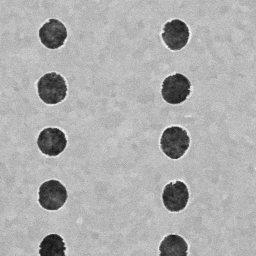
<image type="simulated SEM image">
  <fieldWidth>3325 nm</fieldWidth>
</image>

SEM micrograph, a regular array of holes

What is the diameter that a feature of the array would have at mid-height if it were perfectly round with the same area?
0.385 µm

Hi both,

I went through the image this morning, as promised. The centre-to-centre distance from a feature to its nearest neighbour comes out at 692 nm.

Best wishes